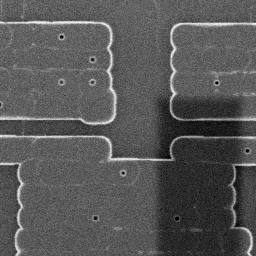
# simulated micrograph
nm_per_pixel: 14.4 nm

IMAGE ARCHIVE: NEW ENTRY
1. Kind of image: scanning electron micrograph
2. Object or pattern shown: wiring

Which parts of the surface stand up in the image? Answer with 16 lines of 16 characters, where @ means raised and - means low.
----------------
@@@@@@-----@@@@@
@@@@@@@----@@@@@
@@@@@@@----@@@@@
@@@@@@@----@@@@@
@@@@@@@----@@@@@
@@@@@@@----@@@@@
-----@@---------
----------------
@@@@@@@----@@@@@
-@@@@@@@@@@@@@@-
-@@@@@@@@@@@@@@-
-@@@@@@@@@@@@@@-
-@@@@@@@@@@@@@@-
-@@@@@@@@@@@@@@-
-@@@@@@@@@@@@@@@